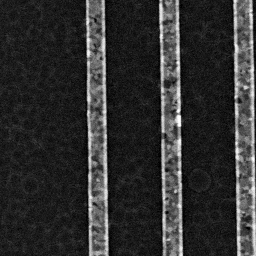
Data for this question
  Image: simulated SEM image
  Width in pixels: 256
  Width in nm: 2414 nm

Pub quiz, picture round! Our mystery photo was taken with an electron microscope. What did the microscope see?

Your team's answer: one or a few lines or trenches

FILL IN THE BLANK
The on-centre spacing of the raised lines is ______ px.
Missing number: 73.9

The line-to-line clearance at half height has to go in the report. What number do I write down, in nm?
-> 542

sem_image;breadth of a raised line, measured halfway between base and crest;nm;152